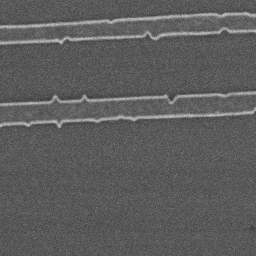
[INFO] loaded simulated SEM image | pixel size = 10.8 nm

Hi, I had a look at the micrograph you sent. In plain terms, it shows one or a few lines or trenches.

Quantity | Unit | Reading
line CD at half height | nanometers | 204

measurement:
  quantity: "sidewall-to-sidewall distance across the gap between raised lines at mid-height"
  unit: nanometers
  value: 668